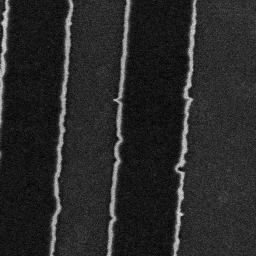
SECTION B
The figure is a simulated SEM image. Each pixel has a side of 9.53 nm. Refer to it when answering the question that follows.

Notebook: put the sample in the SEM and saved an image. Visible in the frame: one or a few lines or trenches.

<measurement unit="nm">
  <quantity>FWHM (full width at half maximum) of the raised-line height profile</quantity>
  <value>642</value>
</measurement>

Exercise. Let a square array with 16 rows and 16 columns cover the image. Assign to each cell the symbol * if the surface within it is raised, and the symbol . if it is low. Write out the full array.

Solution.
****....****....
****....****....
****....****....
****....****....
****....****....
****....****....
****...*****....
****...*****....
****...*****....
****...*****....
****...****.....
****...****.....
****...****.....
****...****.....
***....****.....
***....****.....